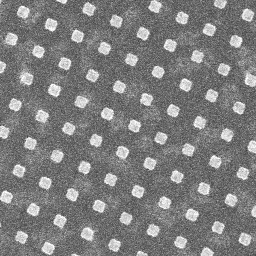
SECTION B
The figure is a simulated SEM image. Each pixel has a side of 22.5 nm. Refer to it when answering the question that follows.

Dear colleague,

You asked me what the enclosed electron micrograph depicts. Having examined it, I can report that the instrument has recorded a regular array of raised bodies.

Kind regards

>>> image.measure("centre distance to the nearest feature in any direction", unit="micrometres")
0.653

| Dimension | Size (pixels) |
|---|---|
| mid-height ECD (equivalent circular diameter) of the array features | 10.8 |